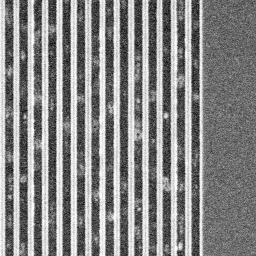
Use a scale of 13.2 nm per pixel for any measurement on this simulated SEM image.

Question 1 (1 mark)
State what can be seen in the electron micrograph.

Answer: parallel lines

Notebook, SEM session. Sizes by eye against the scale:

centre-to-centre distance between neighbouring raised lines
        14.3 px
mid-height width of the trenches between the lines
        0.125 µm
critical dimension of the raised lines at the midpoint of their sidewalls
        62.5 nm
